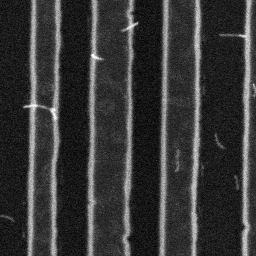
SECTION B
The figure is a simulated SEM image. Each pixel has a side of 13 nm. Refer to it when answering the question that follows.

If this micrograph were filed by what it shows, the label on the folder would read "one or a few lines or trenches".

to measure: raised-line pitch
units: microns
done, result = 0.884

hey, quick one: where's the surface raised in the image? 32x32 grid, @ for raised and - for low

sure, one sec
----@@@-----@@@@-----@@@@------@
----@@@-----@@@@-----@@@@------@
----@@@-----@@@@-----@@@@------@
----@@@-----@@@@-----@@@@------@
----@@@-----@@@@-----@@@@------@
----@@@-----@@@@-----@@@@------@
----@@@-----@@@@-----@@@@------@
----@@@-----@@@@-----@@@@------@
----@@@-----@@@@-----@@@@------@
----@@@----@@@@@-----@@@@------@
----@@@----@@@@@-----@@@@------@
----@@@----@@@@@-----@@@@------@
----@@@----@@@@@-----@@@@------@
----@@@----@@@@@-----@@@@------@
----@@@----@@@@@-----@@@@------@
----@@@-----@@@@-----@@@@------@
----@@@-----@@@@----@@@@@------@
----@@@-----@@@@----@@@@@------@
----@@@-----@@@@----@@@@@------@
----@@@----@@@@@----@@@@-------@
----@@@----@@@@@----@@@@-------@
----@@@----@@@@@----@@@@-------@
----@@@----@@@@@----@@@@-------@
----@@@----@@@@@----@@@@-------@
----@@@----@@@@@----@@@@-------@
----@@@----@@@@@----@@@@-------@
----@@@----@@@@@----@@@@-------@
----@@@----@@@@@----@@@@-------@
----@@@----@@@@@----@@@@-------@
----@@@----@@@@@----@@@@-------@
----@@@----@@@@@----@@@@-------@
----@@@----@@@@@----@@@@-------@